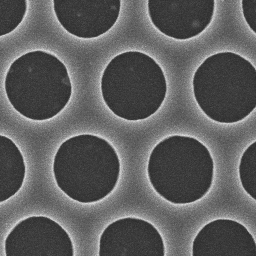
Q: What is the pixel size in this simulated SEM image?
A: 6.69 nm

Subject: holes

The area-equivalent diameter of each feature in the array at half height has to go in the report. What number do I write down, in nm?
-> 449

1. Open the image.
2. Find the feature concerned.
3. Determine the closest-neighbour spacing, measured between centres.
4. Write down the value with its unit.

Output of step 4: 0.633 micrometres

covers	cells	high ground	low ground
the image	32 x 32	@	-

---@@@@--------@@@---------@@@--
---@@@@--------@@@@--------@@@--
---@@@@--------@@@@-------@@@@@-
--@@@@@@------@@@@@@------@@@@@-
@@@@@@@@@@--@@@@@@@@@---@@@@@@@@
@@@@@@@@@@@@@@@@@@@@@@@@@@@@@@@@
@@@@--@@@@@@@@@@--@@@@@@@@@@-@@@
@@-----@@@@@@@-----@@@@@@@-----@
@-------@@@@@-------@@@@@-------
@--------@@@@--------@@@--------
@--------@@@@--------@@@--------
@--------@@@@--------@@@--------
@--------@@@@-------@@@@@-------
@@------@@@@@@------@@@@@-------
@@@----@@@@@@@@----@@@@@@@-----@
@@@@@@@@@@@@@@@@@@@@@@@@@@@@@@@@
@@@@@@@@@@@@@@@@@@@@@@@@@@@@@@@@
-@@@@@@@-----@@@@@@@-----@@@@@@@
--@@@@@-------@@@@@-------@@@@@-
---@@@@--------@@@@-------@@@@--
---@@@@--------@@@@--------@@@--
---@@@@--------@@@---------@@@--
---@@@@--------@@@@--------@@@--
---@@@@@------@@@@@-------@@@@--
-@@@@@@@@----@@@@@@@-----@@@@@@-
@@@@@@@@@@@@@@@@@@@@@@-@@@@@@@@@
@@@@@@@@@@@@@@@@@@@@@@@@@@@@@@@@
@@@---@@@@@@@@@---@@@@@@@@@--@@@
@@------@@@@@------@@@@@@------@
@--------@@@@-------@@@@@------@
@--------@@@--------@@@@--------
@--------@@@---------@@@--------